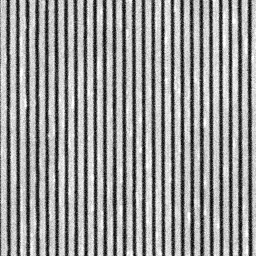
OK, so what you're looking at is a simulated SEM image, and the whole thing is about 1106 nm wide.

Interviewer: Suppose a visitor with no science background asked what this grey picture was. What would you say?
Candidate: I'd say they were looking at parallel lines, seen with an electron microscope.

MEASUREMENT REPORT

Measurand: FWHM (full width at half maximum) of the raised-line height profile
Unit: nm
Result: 24.3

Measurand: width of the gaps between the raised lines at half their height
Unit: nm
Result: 20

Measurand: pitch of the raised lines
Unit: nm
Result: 41.7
